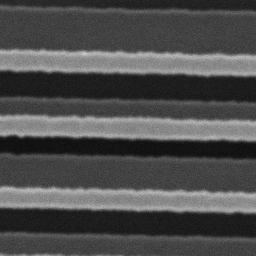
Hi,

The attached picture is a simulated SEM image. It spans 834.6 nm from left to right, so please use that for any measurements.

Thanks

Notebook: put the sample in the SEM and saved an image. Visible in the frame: lines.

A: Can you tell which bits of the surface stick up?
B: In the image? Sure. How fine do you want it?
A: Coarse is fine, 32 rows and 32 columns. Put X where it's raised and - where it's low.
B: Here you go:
--------------------------------
XXXXXXXXXXXXXXXXXXXXXXXXXXXXX-XX
XXXXXXXXXXXXXXXXXXXXXXXXXXXXXXXX
XXXXXXXXXXXXXXXXXXXXXXXXXXXXXXXX
XXXXXXXXXXXXXXXXXXXXXXXXXXXXXXXX
XXXXXXXXXXXXXXXXXXXXXXXXXXXXXXXX
XXXXXXXXXXXXXXXXXXXXXXXXXXXXXXXX
XXXXXXXXXXXXXXXXXXXXXXXXXXXXXXXX
XXXXXXXXXXXXXXXXXXXXXXXXXXXXXXXX
--------------------------------
--------------------------------
--------------------------------
XXXXXXXXXXXX-XX-----------------
XXXXXXXXXXXXXXXXXXXXXXXXXXXXXXXX
XXXXXXXXXXXXXXXXXXXXXXXXXXXXXXXX
XXXXXXXXXXXXXXXXXXXXXXXXXXXXXXXX
XXXXXXXXXXXXXXXXXXXXXXXXXXXXXXXX
------------------------XXXXXXXX
--------------------------------
XXXXXXXXXX--X-------------------
XXXXXXXXXXXXXXXXXXXXXXXXXXXXXXXX
XXXXXXXXXXXXXXXXXXXXXXXXXXXXXXXX
XXXXXXXXXXXXXXXXXXXXXXXXXXXXXXXX
XXXXXXXXXXXXXXXXXXXXXXXXXXXXXXXX
XXXXXXXXXXXXXXXXXXXXXXXXXXXXXXXX
XXXXXXXXXXXXXXXXXXXXXXXXXXXXXXXX
---------------------------XXXXX
--------------------------------
--------------------------------
XXXXXXXXXXXXXXX-XX--------------
XXXXXXXXXXXXXXXXXXXXXXXXXXXXXXXX
XXXXXXXXXXXXXXXXXXXXXXXXXXXXXXXX